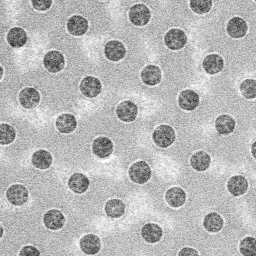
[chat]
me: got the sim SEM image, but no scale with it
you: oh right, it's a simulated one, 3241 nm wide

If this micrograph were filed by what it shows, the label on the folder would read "a regular array of raised bodies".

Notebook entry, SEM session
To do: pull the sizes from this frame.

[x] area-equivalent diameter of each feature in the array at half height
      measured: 290 nanometres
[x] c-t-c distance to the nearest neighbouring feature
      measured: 550 nm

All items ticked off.